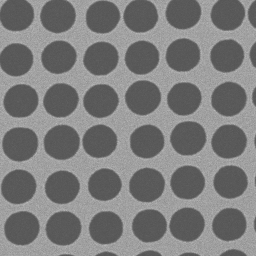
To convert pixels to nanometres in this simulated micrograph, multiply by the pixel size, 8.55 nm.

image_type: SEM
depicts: a regular array of holes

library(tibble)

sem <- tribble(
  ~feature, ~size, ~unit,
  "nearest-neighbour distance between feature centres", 349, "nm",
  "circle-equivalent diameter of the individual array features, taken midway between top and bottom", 34.7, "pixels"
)